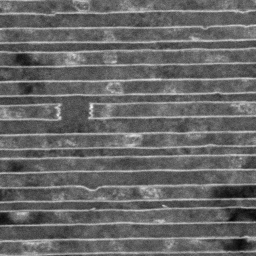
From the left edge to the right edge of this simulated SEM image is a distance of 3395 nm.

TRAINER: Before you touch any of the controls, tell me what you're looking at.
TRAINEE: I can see parallel lines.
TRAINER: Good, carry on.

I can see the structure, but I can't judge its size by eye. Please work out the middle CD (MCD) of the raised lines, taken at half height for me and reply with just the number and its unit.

0.199 micrometres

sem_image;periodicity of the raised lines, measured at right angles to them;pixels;26.4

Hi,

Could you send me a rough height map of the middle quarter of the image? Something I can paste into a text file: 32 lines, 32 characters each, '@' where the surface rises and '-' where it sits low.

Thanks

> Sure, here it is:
@@@-----------------------------
--------------------------------
--------------------------------
--------------------------------
@@@@@@@@@@@@@@@@@@@@@@@@@@@@@@@@
@@@@@@@@@@@@@-@@@@@@@@@@@@@@@@@@
@@@@@@@@@@@@--@@@@@@@@@@@@@@@@@@
@@@@@@@@@@@@@@@@@@@@@@----------
--------------------------------
-------------------------------@
-------@@@@@@@@@@@@@@@@@@@@@@@@@
-------@@@@@@@@@@@@@@@@@@@@@@@@@
-------@@@@@@@@@@@@@@@@@@@@@@@@@
-------@@@@@--------------------
--------------------------------
--------------------------------
--------------------------------
---@--------@@@@@@@@@@@@@@@@@@@@
@@@@@@@@@@@@@@@@---@@@@@@@@@@@@@
@@@@@@@@@@@@@@@----@@@@@@@@@@@@@
@@@@@@@@@@@@@@@@@@@@@@@@@@@@@@@@
--------------------------------
--------------------------------
--@@@@@@@@@@@@@@@@@@@@@@@@@@@@@@
@@@@@@@@@@@@@@@@@@@@@@@@@@@@@@@@
@@@@@@@@@@@@@@@@@@@@@@@@@@@@@@@@
@@@@@@@@@@@@@@@@@@@@@------@@@@@
--------------------------------
--------------------------------
--------------------------------
---------------------@@@@@@@@@@@
@@@@@@@@@@@@@@@@@@@@@@@@@@@@@@@@